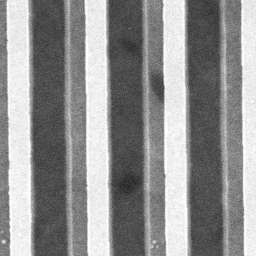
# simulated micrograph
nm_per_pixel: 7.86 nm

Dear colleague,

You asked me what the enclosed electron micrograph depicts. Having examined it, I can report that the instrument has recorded lines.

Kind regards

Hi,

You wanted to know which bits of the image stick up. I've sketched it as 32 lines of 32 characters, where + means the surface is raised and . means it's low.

++++....+++++.....+++++.....++++
++++....+++++.....+++++.....++++
++++....+++++.....+++++.....++++
++++....+++++.....+++++.....++++
++++.....++++.....+++++.....++++
++++.....++++.....+++++.....++++
++++.....++++.....+++++.....++++
++++.....++++.....+++++.....++++
++++.....++++.....+++++.....++++
++++.....++++.....+++++.....++++
++++.....++++.....+++++.....++++
++++.....++++.....+++++.....++++
++++.....++++.....+++++.....++++
++++.....++++.....+++++.....++++
++++.....++++.....+++++.....++++
++++.....++++.....+++++.....++++
++++.....++++.....+++++.....++++
++++.....++++.....+++++.....++++
++++.....++++.....+++++.....++++
++++.....++++......++++.....++++
++++.....++++.....+++++.....++++
++++.....++++......++++.....++++
++++.....++++.....+++++.....++++
++++.....++++.....+++++.....++++
++++.....++++......++++.....++++
++++.....++++......++++.....++++
++++.....++++......++++.....++++
++++.....++++......++++.....++++
++++.....++++......++++.....++++
++++.....+++++.....++++.....++++
++++.....+++++.....++++.....++++
++++.....+++++.....++++.....++++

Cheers